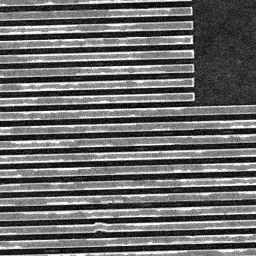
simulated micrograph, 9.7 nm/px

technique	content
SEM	parallel lines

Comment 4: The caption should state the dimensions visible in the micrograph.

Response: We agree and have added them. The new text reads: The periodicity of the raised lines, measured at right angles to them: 139 nm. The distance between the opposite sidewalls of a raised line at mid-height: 0.0679 micrometres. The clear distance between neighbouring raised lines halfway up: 67.9 nanometers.